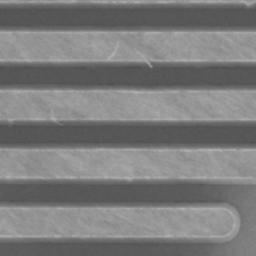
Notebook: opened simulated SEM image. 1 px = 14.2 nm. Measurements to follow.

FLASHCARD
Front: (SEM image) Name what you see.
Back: parallel lines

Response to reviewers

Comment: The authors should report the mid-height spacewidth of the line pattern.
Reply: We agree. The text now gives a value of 347 nm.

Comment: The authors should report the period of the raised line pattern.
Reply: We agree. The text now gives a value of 833 nm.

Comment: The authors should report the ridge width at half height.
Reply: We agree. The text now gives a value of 0.491 micrometres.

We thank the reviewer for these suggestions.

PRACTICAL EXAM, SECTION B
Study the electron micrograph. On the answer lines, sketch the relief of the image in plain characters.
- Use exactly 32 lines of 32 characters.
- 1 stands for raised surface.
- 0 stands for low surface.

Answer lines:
11111111111111111111111111111111
00000000000000000000000000000000
00000000000000000000000000000000
00000000000000000000000000000000
11111111111111111111111111111111
11111111111111111111111111111111
11111111111111111111111111111111
11111111111111111111111111111111
00000000000000000000000000000000
00000000000000000000000000000000
00000000000000000000000000000000
11111111111111111111111111111111
11111111111111111111111111111111
11111111111111111111111111111111
11111111111111111111111111111111
00000000000000000000000000000000
00000000000000000000000000000000
00000000000000000000000000000000
11111111111111111111111111111111
11111111111111111111111111111111
11111111111111111111111111111111
11111111111111111111111111111111
11111111111111111111111111111111
00000000000000000000000000000000
00000000000000000000000000000000
00000000000000000000000000000000
11111111111111111111111111111000
11111111111111111111111111111100
11111111111111111111111111111100
11111111111111111111111111111000
00000000000000000000000000000000
00000000000000000000000000000000